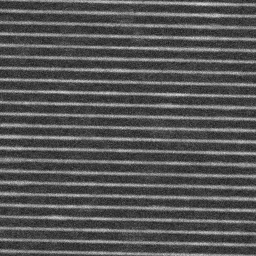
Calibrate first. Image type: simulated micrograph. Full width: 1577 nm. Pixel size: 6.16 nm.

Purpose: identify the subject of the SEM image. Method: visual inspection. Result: parallel lines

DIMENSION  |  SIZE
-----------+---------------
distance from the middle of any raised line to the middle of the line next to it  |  70.4 nm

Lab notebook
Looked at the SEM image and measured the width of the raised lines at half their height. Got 13.9 nanometers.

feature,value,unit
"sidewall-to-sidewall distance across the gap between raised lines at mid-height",9.12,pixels